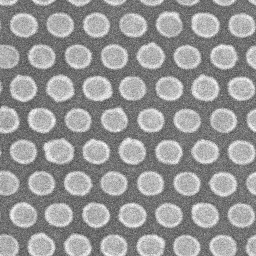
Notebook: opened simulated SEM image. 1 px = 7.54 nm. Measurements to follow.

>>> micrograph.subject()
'a regular array of raised bodies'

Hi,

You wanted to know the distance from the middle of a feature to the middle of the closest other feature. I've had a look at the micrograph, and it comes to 270 nm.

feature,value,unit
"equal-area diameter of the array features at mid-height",186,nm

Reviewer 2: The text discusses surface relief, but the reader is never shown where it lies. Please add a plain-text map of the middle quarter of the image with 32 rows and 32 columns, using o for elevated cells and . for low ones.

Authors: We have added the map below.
..ooo......oooo.....oooo.....ooo
................................
................................
o.....oooo......oo.......ooo....
oo...oooooo....ooooo....ooooo...
oo...ooooooo..oooooo...oooooo...
ooo..ooooooo..oooooo...oooooo...
oo...ooooooo..oooooo....ooooo...
oo....ooooo....oooo......ooo....
................................
................................
..oo.......oooo.....ooo......oo.
.ooooo....ooooo....ooooo....oooo
.ooooo....ooooo....oooooo...oooo
.oooooo...ooooo....oooooo...oooo
.ooooo....ooooo....ooooo....oooo
..ooo......ooo......oooo......oo
................................
................................
o.....oooo.....oooo......ooo....
oo...oooooo...oooooo....ooooo...
oo...oooooo...oooooo...oooooo...
oo...oooooo...oooooo...oooooo...
oo...oooooo...oooooo...oooooo...
o......oo.......ooo......ooo....
................................
................................
.oooo......oo.......ooo......ooo
oooooo....ooooo....ooooo....oooo
ooooooo...ooooo....oooooo...oooo
ooooooo...ooooo....oooooo...oooo
.ooooo....ooooo....ooooo....oooo